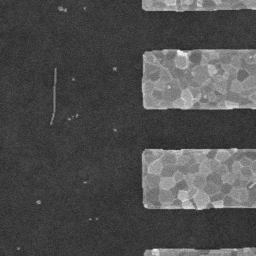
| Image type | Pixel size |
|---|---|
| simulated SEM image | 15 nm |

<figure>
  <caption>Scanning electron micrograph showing wiring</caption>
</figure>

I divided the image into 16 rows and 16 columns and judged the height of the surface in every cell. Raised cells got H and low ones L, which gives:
LLLLLLLLLHHHHHHH
LLLLLLLLLLLLLLLL
LLLLLLLLLLLLLLLL
LLLLLLLLLHHHHHHH
LLLLLLLLLHHHHHHH
LLLLLLLLLHHHHHHH
LLLLLLLLLHHHHHHH
LLLLLLLLLLLLLLLL
LLLLLLLLLLLLLLLL
LLLLLLLLLHHHHHHH
LLLLLLLLLHHHHHHH
LLLLLLLLLHHHHHHH
LLLLLLLLLHHHHHHH
LLLLLLLLLLLLLLLL
LLLLLLLLLLLLLLLL
LLLLLLLLLLLLLLLL